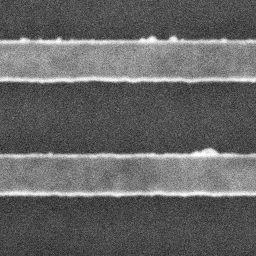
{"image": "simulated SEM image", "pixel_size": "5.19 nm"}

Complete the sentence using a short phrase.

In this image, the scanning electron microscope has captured lines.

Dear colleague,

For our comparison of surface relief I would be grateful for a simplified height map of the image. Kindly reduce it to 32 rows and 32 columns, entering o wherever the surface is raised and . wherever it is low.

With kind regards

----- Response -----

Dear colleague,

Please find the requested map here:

................................
................................
................................
................................
................................
oooooooooooooooooooooooooooooooo
oooooooooooooooooooooooooooooooo
oooooooooooooooooooooooooooooooo
oooooooooooooooooooooooooooooooo
oooooooooooooooooooooooooooooooo
................................
................................
................................
................................
................................
................................
................................
................................
................................
oooooooooooooooooooooooooooooooo
oooooooooooooooooooooooooooooooo
oooooooooooooooooooooooooooooooo
oooooooooooooooooooooooooooooooo
oooooooooooooooooooooooooooooooo
................................
................................
................................
................................
................................
................................
................................
................................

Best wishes